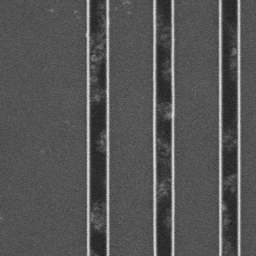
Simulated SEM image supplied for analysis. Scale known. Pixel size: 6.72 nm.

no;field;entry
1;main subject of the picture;one or a few lines or trenches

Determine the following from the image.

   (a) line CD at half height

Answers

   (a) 128 nanometres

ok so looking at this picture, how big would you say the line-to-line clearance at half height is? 318 nanometres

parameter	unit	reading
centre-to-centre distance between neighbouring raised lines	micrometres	0.441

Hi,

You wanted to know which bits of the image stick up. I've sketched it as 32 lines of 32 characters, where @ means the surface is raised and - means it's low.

-----------@@------@@@------@@--
-----------@@------@@@------@@--
-----------@@------@@@------@@--
-----------@@------@@@------@@--
-----------@@------@@@------@@--
-----------@@------@@@------@@--
-----------@@------@@@------@@--
-----------@@------@@@------@@--
-----------@@------@@@------@@--
-----------@@------@@@------@@--
-----------@@------@@@------@@--
-----------@@------@@@------@@--
-----------@@------@@@------@@--
-----------@@------@@@------@@--
-----------@@------@@@------@@--
-----------@@------@@@------@@--
-----------@@------@@@------@@--
-----------@@------@@@------@@--
-----------@@------@@@------@@--
-----------@@------@@@------@@--
-----------@@------@@@------@@--
-----------@@------@@@------@@--
-----------@@------@@@------@@--
-----------@@------@@@------@@--
-----------@@------@@@------@@--
-----------@@------@@@------@@--
-----------@@------@@@------@@--
-----------@@------@@@------@@--
-----------@@------@@@------@@--
-----------@@------@@@------@@--
-----------@@------@@@------@@--
-----------@@------@@@------@@--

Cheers